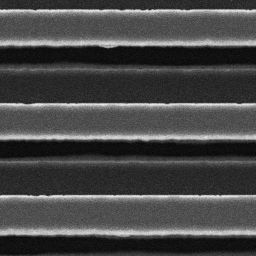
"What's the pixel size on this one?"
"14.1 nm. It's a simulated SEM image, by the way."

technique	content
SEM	lines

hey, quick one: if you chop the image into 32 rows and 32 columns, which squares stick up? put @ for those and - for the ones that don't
@@@@@@@@@@@@@@@@@@@@@@@@@@@@@@@@
@@@@@@@@@@@@@@@@@@@@@@@@@@@@@@@@
@@@@@@@@@@@@@@@@@@@@@@@@@@@@@@@@
@@@@@@@@@@@@@@@@@@@@@@@@@@@@@@@@
@@@@@@@@@@@@@@@@@@@@@@@@@@@@@@@@
@@@@@@@@@@@@@@@@@@@@@@@@@@@@@@@@
--------------------------------
--------------------------------
--------------------------------
@@@@@@@@@@@@@@@@@@@@@@@@@@@@@@@@
@@@@@@@@@@@@@@@@@@@@@@@@@@@@@@@@
@@@@@@@@@@@@@@@@@@@@@@@@@@@@@@@@
@@@@@@@@@@@@@@@@@@@@@@@@@@@@@@@@
@@@@@@@@@@@@@@@@@@@@@@@@@@@@@@@@
@@@@@@@@@@@@@@@@@@@@@@@@@@@@@@@@
@@@@@@@@@@@@@@@@@@@@@@@@@@@@@@@@
@@@@@@@@@@@@@@@@@@@@@@@@@@@@@@@@
@------@--@@-@--@@@@@-@-@@----@-
--------------------------------
--------------------------------
@@@@@@@@@@@@@@@@@@@@@@@@@@@@@@@@
@@@@@@@@@@@@@@@@@@@@@@@@@@@@@@@@
@@@@@@@@@@@@@@@@@@@@@@@@@@@@@@@@
@@@@@@@@@@@@@@@@@@@@@@@@@@@@@@@@
@@@@@@@@@@@@@@@@@@@@@@@@@@@@@@@@
@@@@@@@@@@@@@@@@@@@@@@@@@@@@@@@@
@@@@@@@@@@@@@@@@@@@@@@@@@@@@@@@@
@@@@@@@@@@@@@@@@@@@@@@@@@@@@@@@@
@@@@@@@@@@@@@@@@@@@@@@@@@@@@@@@@
---------------@----------------
--------------------------------
--------------------------------